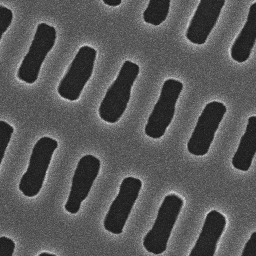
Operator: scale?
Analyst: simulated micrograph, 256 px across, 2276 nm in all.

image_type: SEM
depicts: a regular array of holes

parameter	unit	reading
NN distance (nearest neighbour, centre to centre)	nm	406